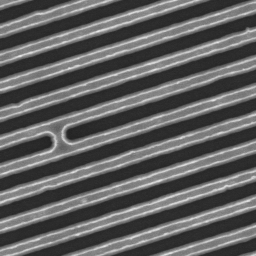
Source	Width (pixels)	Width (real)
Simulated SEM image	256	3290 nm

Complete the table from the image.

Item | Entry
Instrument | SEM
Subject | parallel lines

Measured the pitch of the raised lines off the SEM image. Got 0.343 microns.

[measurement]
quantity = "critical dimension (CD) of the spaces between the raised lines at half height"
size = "208 nanometres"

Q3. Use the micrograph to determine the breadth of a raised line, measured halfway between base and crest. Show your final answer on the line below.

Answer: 132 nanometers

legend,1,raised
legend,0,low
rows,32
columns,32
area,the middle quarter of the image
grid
11111000000000000001111111100000
10000000000000011111111100000000
00000000000011111111100000000000
00000000111111111100000000000001
00000111111111000000000000001111
00111111111000000000000001111111
11111111000000000000011111111100
11111000000000000011111111100000
11000000000000011111111100000000
00000000000011111111000000000000
00000000011111111000000000000001
00000011111111000000000000001111
00111111111000000000000001111111
11111111000000000000011111111100
11111000000000000011111111100000
11000000000000011111111100000000
00000000000011111111100000000000
00000000011111111100000000000001
00000111111111000000000000001111
10111111111000000000000001111111
11111111000000000000011111111100
11111000000000000011111111100000
11000000000000011111111100000000
00000000000011111111100000000000
00000000011111111000000000000001
00000011111111100000000000001111
00011111111100000000000001111111
11111111000000000000011111111100
11111000000000000011111111100000
11000000000000011111111100000000
00000000000011111111100000000000
00000000011111111100000000000001